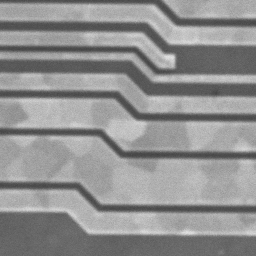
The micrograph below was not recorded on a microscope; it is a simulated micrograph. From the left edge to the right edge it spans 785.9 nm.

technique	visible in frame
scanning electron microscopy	groups of lines, slits or small figures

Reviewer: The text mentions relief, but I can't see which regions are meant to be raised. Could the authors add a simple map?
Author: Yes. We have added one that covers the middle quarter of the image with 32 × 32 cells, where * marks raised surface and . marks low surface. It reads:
...................**..****.....
....................**..........
....................***.........
****************.....***********
*****************...............
******************..............
.............******.............
...............*****............
................***************.
*************....***************
**************....**************
***************....*************
****************................
*****************...............
******************..............
********************************
..........**********************
...........*********************
*********...********************
**********...*******************
***********...******************
************.....***************
*************...................
**************..................
********************************
********************************
********************************
********************************
********************************
....****************************
.....***************************
......**************************